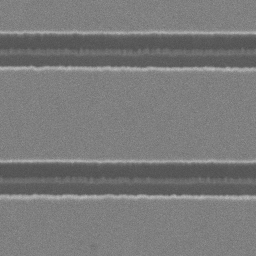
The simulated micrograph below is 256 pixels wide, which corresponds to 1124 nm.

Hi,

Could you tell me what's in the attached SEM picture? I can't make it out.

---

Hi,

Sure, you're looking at lines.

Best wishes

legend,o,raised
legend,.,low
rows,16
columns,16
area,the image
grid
oooooooooooooooo
oooooooooooooooo
................
................
oooooooooooooooo
oooooooooooooooo
oooooooooooooooo
oooooooooooooooo
oooooooooooooooo
oooooooooooooooo
................
................
oooooooooooooooo
oooooooooooooooo
oooooooooooooooo
oooooooooooooooo